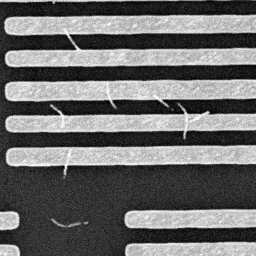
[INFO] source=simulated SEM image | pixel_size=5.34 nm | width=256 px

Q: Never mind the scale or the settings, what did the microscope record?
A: wiring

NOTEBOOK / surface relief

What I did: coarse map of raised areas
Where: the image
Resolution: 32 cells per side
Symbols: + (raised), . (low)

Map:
................................
................................
.+++++++++++++++++++++++++++++++
.+++++++++++++++++++++++++++++++
................................
................................
.+++++++++++++++++++++++++++++++
.+++++++++++++++++++++++++++++++
................................
................................
.+++++++++++++++++++++++++++++++
.+++++++++++++++++++++++++++++++
....++..........................
................................
.+++++++++++++++++++++++++++++++
.+++++++++++++++++++++++++++++++
................................
................................
.....+++++++++++++++++++++++++++
.+++++++++++++++++++++++++++++++
.+++++++++++++++++..............
................................
................................
................................
................................
................................
................++++++++++++++++
++..............++++++++++++++++
++..............................
................................
.....................+++++++++++
++..............++++++++++++++++